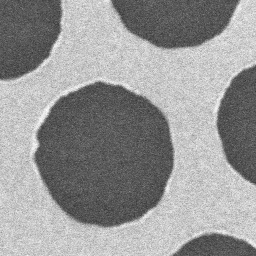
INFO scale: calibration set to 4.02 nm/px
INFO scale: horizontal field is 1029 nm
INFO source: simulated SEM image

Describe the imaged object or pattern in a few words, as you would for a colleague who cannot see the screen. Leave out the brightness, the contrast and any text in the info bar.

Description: holes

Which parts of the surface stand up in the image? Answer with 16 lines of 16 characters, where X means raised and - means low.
----XXX--------X
----XXXX------XX
----XXXXX----XXX
---XXXXXXXXXXXXX
--XXXXXXXXXXXXX-
XXXXX---XXXXXX--
XXX-------XXXX--
XXX-------XXXX--
XX---------XXX--
XX---------XXX--
XX---------XXXX-
XXX-------XXXXXX
XXX-------XXXXXX
XXXX-----XXXXXXX
XXXXXXXXXXXXXXXX
XXXXXXXXXXX-----